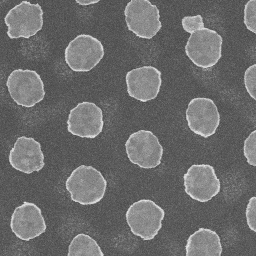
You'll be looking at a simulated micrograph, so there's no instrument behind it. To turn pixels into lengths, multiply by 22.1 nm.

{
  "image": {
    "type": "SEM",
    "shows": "a regular array of raised bodies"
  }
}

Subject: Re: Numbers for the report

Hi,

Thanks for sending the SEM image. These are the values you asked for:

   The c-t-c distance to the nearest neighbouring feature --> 1.47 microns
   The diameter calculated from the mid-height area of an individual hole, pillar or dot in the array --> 0.803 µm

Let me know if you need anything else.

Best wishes